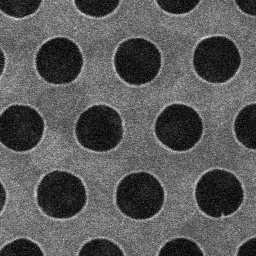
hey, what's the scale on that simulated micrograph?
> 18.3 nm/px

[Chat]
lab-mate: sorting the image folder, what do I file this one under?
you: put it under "a regular array of holes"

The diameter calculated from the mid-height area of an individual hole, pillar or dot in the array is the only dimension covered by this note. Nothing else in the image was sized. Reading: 884 nanometers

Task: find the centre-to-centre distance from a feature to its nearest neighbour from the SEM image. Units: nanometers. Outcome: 1410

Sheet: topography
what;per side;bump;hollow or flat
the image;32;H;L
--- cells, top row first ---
LLLLLHHHHLLLLLLHHHHHLLLLLHHHHHLL
LLLLHHHHHHLLLLHHHHHHHLLLHHHHHHLL
HHHHHHHHHHHHHHHHHHHHHHHHHHHHHHHH
HHHHHHHHHHHHHHHHHHHHHHHHHHHHHHHH
HHHHHHHHHHHHHHHHHHHHHHHHHHHHHHHH
HHHHHLLLLHHHHHHLLLLHHHHHHLLLLHHH
HHHHHLLLLLHHHHLLLLLLHHHHLLLLLLHH
LHHHLLLLLLHHHHLLLLLLHHHHLLLLLLHH
LHHHHLLLLLHHHHLLLLLLHHHHLLLLLLHH
HHHHHLLLLLHHHHHLLLLLHHHHHLLLLHHH
HHHHHHHLHHHHHHHHLLHHHHHHHHHHHHHH
HHHHHHHHHHHHHHHHHHHHHHHHHHHHHHHH
HHHHHHHHHHHHHHHHHHHHHHHHHHHHHHHH
HLLLHHHHHHHLLLHHHHHHHLLLHHHHHHLL
LLLLLHHHHHLLLLLHHHHHLLLLLHHHHHLL
LLLLLLHHHLLLLLLHHHHLLLLLLHHHHLLL
LLLLLHHHHLLLLLLHHHHLLLLLLHHHHLLL
LLLLLHHHHHLLLLLHHHHHLLLLLHHHHHLL
HLLLHHHHHHHLLLHHHHHHHLLLHHHHHHHL
HHHHHHHHHHHHHHHHHHHHHHHHHHHHHHHH
HHHHHHHHHHHHHHHHHHHHHHHHHHHHHHHH
HHHHHHLLLHHHHHHHHHHHHHHHHHLLLHHH
HHHHHLLLLLHHHHHLLLLLHHHHHLLLLLHH
LHHHHLLLLLLHHHHLLLLLHHHHLLLLLLHH
LHHHLLLLLLLHHHLLLLLLLHHHLLLLLLLH
LHHHHLLLLLLHHHHLLLLLHHHHHLLLLLHH
HHHHHLLLLLHHHHHLLLLLHHHHHLLLLHHH
HHHHHHHHHHHHHHHHHLHHHHHHHHHHHHHH
HHHHHHHHHHHHHHHHHHHHHHHHHHHHHHHH
HHHHHHHHHHHHHHHHHHHHHHHHHHHHHHHH
HLLLLHHHHHLLLLHHHHHHHLLLLHHHHHLL
LLLLLHHHHHLLLLLHHHHHLLLLLHHHHHLL